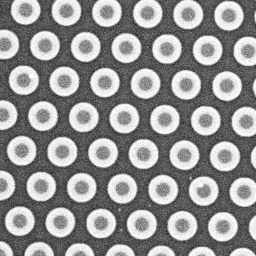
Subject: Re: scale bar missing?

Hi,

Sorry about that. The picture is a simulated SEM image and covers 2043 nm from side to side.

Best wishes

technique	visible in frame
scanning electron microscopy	an array of small figures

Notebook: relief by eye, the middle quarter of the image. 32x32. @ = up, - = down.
--------------------------------
@@-------@@@-------@@@----------
@@@----@@@@@@-----@@@@@-----@@@@
@@@@---@@@@@@@---@@@@@@@---@@@@@
@@@@---@@@@@@@---@@@@@@@---@@@@@
@@@@---@@@@@@@---@@@@@@@---@@@@@
@@@----@@@@@@----@@@@@@@---@@@@@
@@------@@@@------@@@@@-----@@@@
--------------------@--------@@@
--------------------------------
---@@@@------@@@@-------@@@-----
--@@@@@@----@@@@@@-----@@@@@----
-@@@@@@@----@@@@@@@---@@@@@@@---
-@@@@@@@@---@@@@@@@---@@@@@@@---
--@@@@@@----@@@@@@@---@@@@@@@---
--@@@@@@----@@@@@@----@@@@@@----
---@@@@------@@@@------@@@@@----
--------------------------------
@-------------------------------
@@-----@@@@@------@@@@-------@@-
@@@----@@@@@@----@@@@@@----@@@@@
@@@---@@@@@@@---@@@@@@@----@@@@@
@@@---@@@@@@@---@@@@@@@----@@@@@
@@@---@@@@@@@---@@@@@@@----@@@@@
@@-----@@@@@@----@@@@@@----@@@@@
@-------@@@-------@@@@------@@@@
--------------------------------
---@@@--------------------------
--@@@@@-----@@@@@------@@@@-----
-@@@@@@@---@@@@@@@----@@@@@@----
-@@@@@@@---@@@@@@@---@@@@@@@----
-@@@@@@@---@@@@@@@---@@@@@@@---@